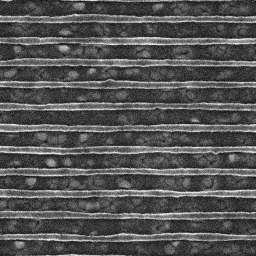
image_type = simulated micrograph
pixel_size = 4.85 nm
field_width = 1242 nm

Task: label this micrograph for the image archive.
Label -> parallel lines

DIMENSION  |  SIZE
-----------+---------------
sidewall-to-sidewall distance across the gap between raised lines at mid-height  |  0.0782 µm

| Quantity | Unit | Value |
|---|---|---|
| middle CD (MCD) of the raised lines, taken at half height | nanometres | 28.5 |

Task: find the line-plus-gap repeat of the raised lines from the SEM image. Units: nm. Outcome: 106